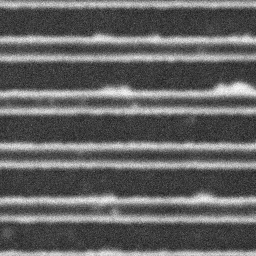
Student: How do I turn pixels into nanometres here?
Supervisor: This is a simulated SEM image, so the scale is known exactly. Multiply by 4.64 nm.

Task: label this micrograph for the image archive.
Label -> lines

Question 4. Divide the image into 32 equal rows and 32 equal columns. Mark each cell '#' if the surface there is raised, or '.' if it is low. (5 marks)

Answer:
################################
................................
................................
................................
................................
################################
################################
.#..............................
................................
................................
................................
.##..#.........#....#......#####
################################
################################
................................
................................
................................
................................
################################
################################
################################
................................
................................
................................
................................
################################
################################
..###.#..#..####################
................................
................................
................................
.#..............................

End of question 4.